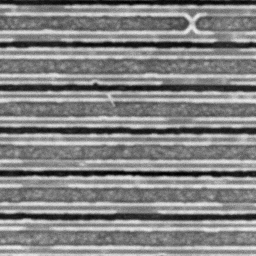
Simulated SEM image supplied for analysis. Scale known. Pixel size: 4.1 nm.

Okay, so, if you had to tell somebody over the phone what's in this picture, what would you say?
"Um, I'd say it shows parallel lines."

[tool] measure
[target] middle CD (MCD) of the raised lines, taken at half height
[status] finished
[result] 45.6 nm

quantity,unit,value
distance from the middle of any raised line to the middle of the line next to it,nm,88.2